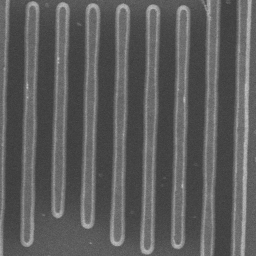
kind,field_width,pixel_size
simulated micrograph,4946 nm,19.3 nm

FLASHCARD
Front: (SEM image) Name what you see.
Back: groups of lines, slits or small figures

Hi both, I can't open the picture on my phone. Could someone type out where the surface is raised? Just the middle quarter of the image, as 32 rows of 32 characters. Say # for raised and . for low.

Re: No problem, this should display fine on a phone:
#.....##.....###.....##.....###.
#.....##.....###.....##.....###.
#.....##.....###.....##.....###.
#.....##.....###.....##.....###.
#.....##.....###.....##.....###.
#....###.....###.....##.....###.
#....###.....###.....##.....###.
#....###.....###....###.....###.
#....###.....###....###.....###.
.....###.....###....###.....###.
.....###.....###....###.....###.
.....###.....###....###.....###.
.....###.....###....###.....###.
.....###.....##.....###.....###.
.....###.....##.....###.....###.
.....###.....##.....###.....###.
.....###.....##.....###.....##..
.....###.....##.....###.....##..
.....###.....##.....###.....##..
.....###.....##.....###.....##..
.....###.....##.....###.....##..
.....###.....##.....###.....##..
.....###.....##.....###.....##..
.....###.....##.....###.....##..
.....###.....##.....###.....##..
.....###.....##.....###.....##..
.....###.....##.....###.....##..
.....###.....##.....###.....##..
.....###.....##.....###.....##..
.....##.....###.....##......##..
.....##.....###.....##......##..
.....##.....###.....##......##..